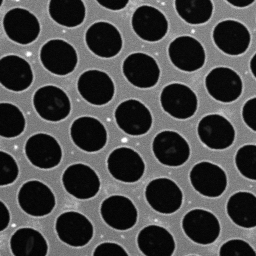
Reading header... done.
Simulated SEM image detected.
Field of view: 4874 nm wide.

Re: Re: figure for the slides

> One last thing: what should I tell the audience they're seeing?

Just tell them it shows a regular array of holes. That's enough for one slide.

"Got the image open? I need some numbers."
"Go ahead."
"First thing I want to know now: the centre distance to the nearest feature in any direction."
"0.908 µm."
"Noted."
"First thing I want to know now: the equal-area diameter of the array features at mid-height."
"692 nm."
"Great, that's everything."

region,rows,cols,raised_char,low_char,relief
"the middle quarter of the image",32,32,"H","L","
LLLHHHHHHHHHHHHLLLLLLLLLHHHHLLLL
LLHHHHHLHHHHHHHLLLLLLLLLHHHHHLLL
LHHHLLLLLLLHHHHLLLLLLLLLHHHHHHHH
HHHHLLLLLLLLHHHHLLLLLLLLHHHHHHHH
HHHLLLLLLLLLHHHHLLLLLLLHHHHHHHHH
HHHLLLLLLLLLLHHHHHLLLLHHHLLLLLLH
HHHLLLLLLLLLLHHHHHHHHHHHHLLLLLLL
LHHHLLLLLLLLHHHHHHHHHHHHLLLLLLLL
LHHHHLLLLLLLHHHHHHHHHHHHLLLLLLLL
LLHHHHLLLLLHHHHLLLLHHHHHLLLLLLLL
LLHHHHHHHHHHHLLLLLLLHHHHLLLLLLLL
LLHHHHHHHHHHHLLLLLLLLHHHHLLLLLLL
LHHHHHHHHHHHHLLLLLLLLLHHHHLLLLLL
HHHHLLLLHHHHHLLLLLLLLLHHHHHHLLLH
HHLLLLLLLHHHHLLLLLLLLLHHHHHHHHHH
HHLLLLLLLLHHHHLLLLLLLLHHHHHHHHHH
HHLLLLLLLLHHHHHLLLLLLHHHHHHHHHHH
HHLLLLLLLLLHHHHHLLLLHHHLLLLLLHHH
HHLLLLLLLLLHHHHHHHHHHHHLLLLLLLHH
HHLLLLLLLLLHHHHHHHHHHHLLLLLLLLLH
HHHLLLLLLLHHHHHHHHHHHHLLLLLLLLLH
HHHHHLLLLHHHHLLLLHHHHHLLLLLLLLLL
HHHHHHHHHHHHLLLLLLLHHHLLLLLLLLLH
HHHHHHHHHHHLLLLLLLLHHHHLLLLLLLLH
HHHHHHHHHHHLLLLLLLLLHHHHLLLLLLHH
HLLLLLHHHHHLLLLLLLLLHHHHHHHLHHHH
LLLLLLLHHHHLLLLLLLLLHHHHHHHHHHHH
LLLLLLLLHHHHLLLLLLLLHHHHHHHHHHHL
LLLLLLLLLHHHLLLLLLLHHHHHLLHHHHHL
LLLLLLLLLHHHHHHLLLHHHHLLLLLHHHHH
LLLLLLLLLHHHHHHHHHHHHLLLLLLLLHHH
LLLLLLLLLHHHHHHHHHHHLLLLLLLLLHHH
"